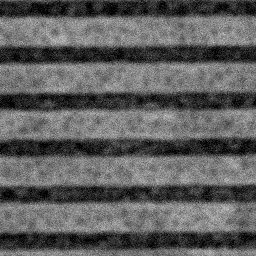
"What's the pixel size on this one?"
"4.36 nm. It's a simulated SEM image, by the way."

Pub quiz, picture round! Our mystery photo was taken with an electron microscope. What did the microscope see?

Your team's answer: parallel lines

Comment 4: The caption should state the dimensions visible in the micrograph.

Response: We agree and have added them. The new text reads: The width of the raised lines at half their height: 26.7 px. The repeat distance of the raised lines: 0.203 µm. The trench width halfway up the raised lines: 0.0872 µm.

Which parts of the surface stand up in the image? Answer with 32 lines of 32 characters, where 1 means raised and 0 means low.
00000000000000000000000000000000
00000000000000000000000000000000
11111111111111111111111111111111
11111111111111111111111111111111
11111111111111111111111111111111
11111111111111111111111111111000
00000000000000000000000000000000
00000000000000000000000000000000
11111111111111111111111111111111
11111111111111111111111111111111
11111111111111111111111111111111
00000000000000000000000000000000
00000000000000000000000000000000
00000000000000000000000000000000
11111111111111111111111111111111
11111111111111111111111111111111
11111111111111111111111111111111
00000000000000000000000000000000
00000000000000000000000000000000
00000000000000000000000000000000
11111111111111111111111111111111
11111111111111111111111111111111
11111111111111111111111111111111
00000000000000000000000000000000
00000000000000000000000000000000
00000000000000000100000000000000
11111111111111111111111111111111
11111111111111111111111111111111
11111111111111111111111111111111
00000000000000000000000000000000
00000000000000000000000000000000
01011110001111111111111111111111